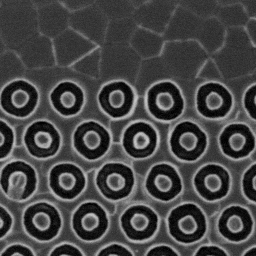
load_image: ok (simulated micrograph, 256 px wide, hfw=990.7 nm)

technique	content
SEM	a regular array of ring-shaped grooves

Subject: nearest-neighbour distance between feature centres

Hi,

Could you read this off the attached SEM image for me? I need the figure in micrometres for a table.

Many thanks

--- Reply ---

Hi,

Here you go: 0.182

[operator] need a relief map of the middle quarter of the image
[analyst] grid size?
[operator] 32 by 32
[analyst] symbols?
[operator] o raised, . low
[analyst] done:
oooooooooooooooooooooooooooooooo
oooooooooooooooooooooooooooooooo
oooooooooooooooooooooooooooooooo
oooooooooooooooooooooooooooooooo
..ooooooooooo..ooooooooo...ooooo
...ooooooo......oooooo......oooo
....ooooo....o...oooo........ooo
oo...oooo...ooo...ooo...oo...ooo
ooo..oooo..oooo...o.o..oooo...oo
ooo..oooo...ooo..o.oo..oooo...oo
oo...oooo...oo...oooo..oooo...oo
....oooooo.......oooo.........oo
...oooooooo.....oooooo.......ooo
ooooooooooooooooooooooo.....oooo
oooooo.oooooooooooo.oooooooooo..
oooo.....ooooooo......oooooo....
ooo.......oooooo.......oooo.....
ooo...oo...oooo...oo...oooo...oo
oo...oooo...ooo..oooo..o.oo..ooo
oo...oooo...ooo..oo.o..oooo..ooo
ooo...ooo..oooo...ooo..oooo..ooo
ooo........oooo........oooo....o
oooo......oooooo......oooooo....
ooooo....ooooooooo..ooooooooo...
oooooooooooooooooooooooooooooooo
...ooooooo......ooooooo....ooooo
....ooooo........ooooo......oooo
oo...ooo.........oooo........ooo
ooo..ooo...oooo...ooo..ooo...ooo
ooo..ooo...oooo...oo...oooo..ooo
oo...ooo...oooo..ooo...oooo..ooo
.....oooo...o....oooo...oo...ooo